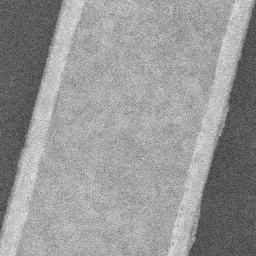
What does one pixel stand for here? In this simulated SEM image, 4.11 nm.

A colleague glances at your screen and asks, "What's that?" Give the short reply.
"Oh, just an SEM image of one or a few lines or trenches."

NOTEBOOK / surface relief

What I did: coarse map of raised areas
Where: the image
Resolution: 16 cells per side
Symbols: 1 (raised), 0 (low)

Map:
0000111111111110
0000111111111110
0000111111111110
0000111111111100
0001111111111100
0001111111111100
0001111111111100
0001111111111000
0011111111111000
0011111111111000
0011111111110000
0011111111110000
0111111111110000
0111111111110000
0111111111100000
1111111111100000